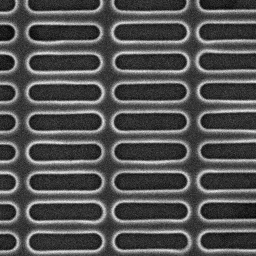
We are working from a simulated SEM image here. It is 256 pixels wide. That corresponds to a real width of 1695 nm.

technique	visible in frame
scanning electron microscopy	groups of lines, slits or small figures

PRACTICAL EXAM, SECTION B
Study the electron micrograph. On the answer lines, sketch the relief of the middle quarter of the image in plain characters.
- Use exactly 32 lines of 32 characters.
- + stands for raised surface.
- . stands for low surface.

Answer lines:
.........++++..................+
........++++++................++
++++++++++++++++++++++++++++++++
++++++++++++++++++++++++++++++++
++++++++++++++++++++++++++++++++
.........++++.................++
..........++...................+
..........++...................+
.........++++.................++
........++++++++++++++++++++++++
++++++++++++++++++++++++++++++++
++++++++++++++++++++++++++++++++
.........+++++................++
..........++...................+
..........++...................+
..........++...................+
........+++++................+++
++++++++++++++++++++++++++++++++
++++++++++++++++++++++++++++++++
+++++++++++++++++++++...++++++++
.........++++.................++
.........+++...................+
.........+++...................+
.........++++.................++
++++++++++++++++++++...+++++++++
++++++++++++++++++++++++++++++++
++++++++++++++++++++++++++++++++
........+++++.................++
.........++++..................+
..........++...................+
.........++++..................+
........++++++...............+++